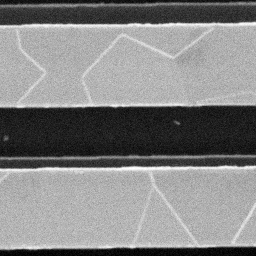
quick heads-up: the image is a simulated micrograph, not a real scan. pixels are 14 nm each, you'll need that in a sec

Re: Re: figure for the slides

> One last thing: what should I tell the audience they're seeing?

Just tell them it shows lines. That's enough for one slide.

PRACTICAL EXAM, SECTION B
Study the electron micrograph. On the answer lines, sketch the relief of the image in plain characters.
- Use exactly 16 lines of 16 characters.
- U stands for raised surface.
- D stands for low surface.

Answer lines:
UUUUUUUUUUUUUUUU
UUUUUUUUUUUUUUUU
UUUUUUUUUUUUUUUU
UUUUUUUUUUUUUUUU
UUUUUUUUUUUUUUUU
UUUUUUUUUUUUUUUU
UUUUUUUUUUUUUDDD
DDDDDDDDDDDDDDDD
DDDDDDDDDDDDDDDD
DDDDDDDDDDDDDDDD
UUUUUUUUUUUUUUUU
UUUUUUUUUUUUUUUU
UUUUUUUUUUUUUUUU
UUUUUUUUUUUUUUUU
UUUUUUUUUUUUUUUU
UUUUDDDDDDDDDDDD